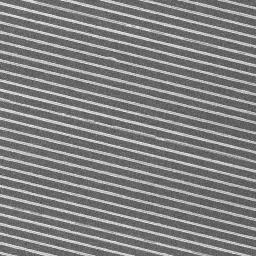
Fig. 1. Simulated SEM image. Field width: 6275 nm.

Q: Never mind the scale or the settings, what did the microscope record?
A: parallel lines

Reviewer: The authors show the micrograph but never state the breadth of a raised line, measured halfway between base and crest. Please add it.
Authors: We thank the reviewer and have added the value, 0.0566 um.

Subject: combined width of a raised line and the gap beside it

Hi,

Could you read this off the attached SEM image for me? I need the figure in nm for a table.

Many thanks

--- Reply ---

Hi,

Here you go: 228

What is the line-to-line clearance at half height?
173 nm